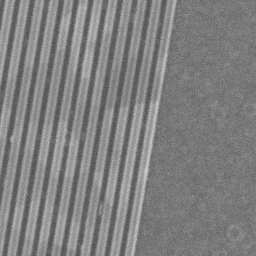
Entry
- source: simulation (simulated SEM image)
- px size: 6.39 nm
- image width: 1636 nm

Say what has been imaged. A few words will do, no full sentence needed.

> parallel lines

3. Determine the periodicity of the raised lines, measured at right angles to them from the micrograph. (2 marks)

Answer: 0.0925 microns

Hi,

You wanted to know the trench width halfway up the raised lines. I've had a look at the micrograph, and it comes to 46.5 nm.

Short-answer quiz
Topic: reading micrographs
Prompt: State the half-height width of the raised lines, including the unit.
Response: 46.5 nm